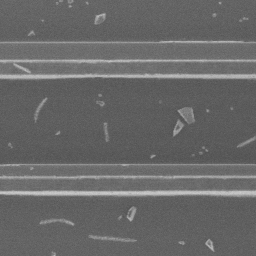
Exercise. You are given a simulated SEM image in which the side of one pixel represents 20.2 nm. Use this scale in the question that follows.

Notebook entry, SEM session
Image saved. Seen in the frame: lines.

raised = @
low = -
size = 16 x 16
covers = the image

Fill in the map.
----------------
----------------
----------------
@@@@@@@@@@@@@@@@
@@@@@@@@@@@@@@@@
----------------
----------------
----------------
----------------
----------------
@@@@@@@@@@@@@@@@
@@@@@@@@@@@@@@@@
----------------
----------------
----------------
----------------